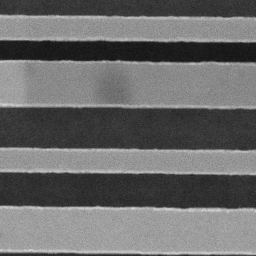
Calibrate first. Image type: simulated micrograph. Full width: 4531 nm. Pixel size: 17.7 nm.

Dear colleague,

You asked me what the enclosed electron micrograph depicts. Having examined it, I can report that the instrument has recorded lines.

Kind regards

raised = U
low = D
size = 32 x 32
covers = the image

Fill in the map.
DDDDDDDDDDDDDDDDDDDDDDDDDDDDDDDD
DDDDDDDDDDDDDDDDDDDDDDDDDDDDDDDD
UUUUUUUUUUUUUUUUUUUUUUUUUUUUUUUU
UUUUUUUUUUUUUUUUUUUUUUUUUUUUUUUU
UUUUUUUUUUUUUUUUUUUUUUUUUUUUUUUU
DDDDDDDDDDDDDDDDDDDDDDDDDDDDDDDD
DDDDDDDDDDDDDDDDDDDDDDDDDDDDDDDD
DDDDDDDDDDDDDDDDDDDDDDDDDDDDDDDD
UUUUUUUUUUUUUUUUUUUUUUUUUUUUUUUU
UUUUUUUUUUUUUUUUUUUUUUUUUUUUUUUU
UUUUUUUUUUUUUUUUUUUUUUUUUUUUUUUU
UUUUUUUUUUUUUUUUUUUUUUUUUUUUUUUU
UUUUUUUUUUUUUUUUUUUUUUUUUUUUUUUU
DDDDDDDDDDDDDDDDDDDDDDDDDDDDDDDD
DDDDDDDDDDDDDDDDDDDDDDDDDDDDDDDD
DDDDDDDDDDDDDDDDDDDDDDDDDDDDDDDD
DDDDDDDDDDDDDDDDDDDDDDDDDDDDDDDD
DDDDDDDDDDDDDDDDDDDDDDDDDDDDDDDD
DDDDDDDDDDDDDDDDDDDDDDDDDDDDDDDD
UUUUUUUUUUUUUUUUUUUUUUUUUUUUUUUU
UUUUUUUUUUUUUUUUUUUUUUUUUUUUUUUU
DDDUDUDUUUUUUUUUUUUUUUUUUUUUUUUU
DDDDDDDDDDDDDDDDDDDDDDDDDDDDDDDD
DDDDDDDDDDDDDDDDDDDDDDDDDDDDDDDD
DDDDDDDDDDDDDDDDDDDDDDDDDDDDDDDD
DDDDDDDDDDDDDDDDDDDDDDDDDDDDDDDD
UUUUUUUUUUUUUUUUUUUUUUUUUUUUUUUU
UUUUUUUUUUUUUUUUUUUUUUUUUUUUUUUU
UUUUUUUUUUUUUUUUUUUUUUUUUUUUUUUU
UUUUUUUUUUUUUUUUUUUUUUUUUUUUUUUU
UUUUUUUUUUUUUUUUUUUUUUUUUUUUUUUU
DDUDUUUUUUUUUUUUUUUUUUUUUUUUUUUU